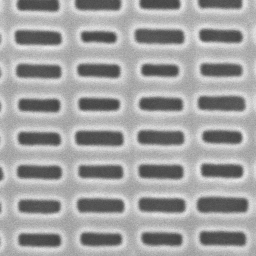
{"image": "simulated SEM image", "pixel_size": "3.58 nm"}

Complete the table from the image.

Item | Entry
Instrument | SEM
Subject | a regular array of holes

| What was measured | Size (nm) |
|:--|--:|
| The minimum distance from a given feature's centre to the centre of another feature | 120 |